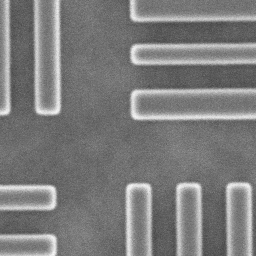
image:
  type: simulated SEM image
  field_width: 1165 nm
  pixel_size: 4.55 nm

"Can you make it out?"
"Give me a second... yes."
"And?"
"groups of lines, slits or small figures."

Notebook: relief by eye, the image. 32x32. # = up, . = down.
#...###..........###############
#...###..........###############
#...###.........................
#...###.........................
#...###.........................
#...###.........................
#....##..........###############
#....##..........###############
#....##.........................
#....##.........................
#....##.........................
#....##..........###############
#....##..........###############
#....##..........###############
.................###############
................................
................................
................................
................................
................................
................................
................................
................................
######..........###...###...###.
#######.........###...###...###.
#######.........###...###...###.
................###...###...###.
................###...###...###.
................###...###...###.
................###...###...###.
#######.........###...###....##.
#######.........###...###....##.